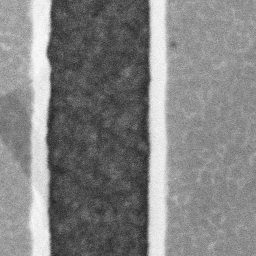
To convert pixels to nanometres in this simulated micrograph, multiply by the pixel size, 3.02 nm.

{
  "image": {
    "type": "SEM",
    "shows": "one or a few lines or trenches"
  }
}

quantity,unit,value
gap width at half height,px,119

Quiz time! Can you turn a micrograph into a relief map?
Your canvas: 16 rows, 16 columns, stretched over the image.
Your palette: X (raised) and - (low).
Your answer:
XXX-------XXXXXX
XXX-------XXXXXX
XXX-------XXXXXX
XX--------XXXXXX
XXX-------XXXXXX
XXX-------XXXXXX
XXX-------XXXXXX
XX--------XXXXXX
XX--------XXXXXX
XX--------XXXXXX
XX--------XXXXXX
XX--------XXXXXX
XX--------XXXXXX
XX--------XXXXXX
XXX-------XXXXXX
XXX-------XXXXXX